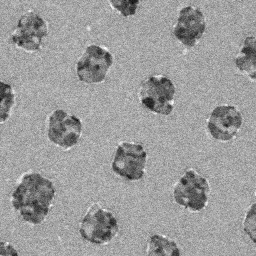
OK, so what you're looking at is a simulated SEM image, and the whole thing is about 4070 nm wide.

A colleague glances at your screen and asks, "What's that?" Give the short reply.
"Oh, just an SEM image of a regular array of raised bodies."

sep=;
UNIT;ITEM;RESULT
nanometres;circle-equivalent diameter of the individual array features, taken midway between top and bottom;595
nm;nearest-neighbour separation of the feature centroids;1130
